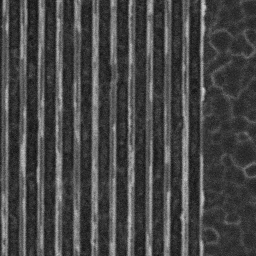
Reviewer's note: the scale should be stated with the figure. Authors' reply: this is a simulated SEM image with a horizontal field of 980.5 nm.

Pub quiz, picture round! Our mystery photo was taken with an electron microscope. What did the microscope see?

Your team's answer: parallel lines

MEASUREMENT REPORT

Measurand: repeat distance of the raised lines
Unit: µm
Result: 0.069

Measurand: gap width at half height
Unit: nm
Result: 46.4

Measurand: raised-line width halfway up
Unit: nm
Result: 21.5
